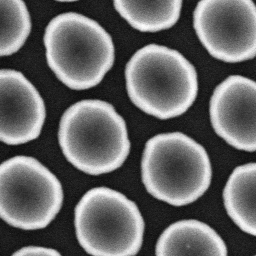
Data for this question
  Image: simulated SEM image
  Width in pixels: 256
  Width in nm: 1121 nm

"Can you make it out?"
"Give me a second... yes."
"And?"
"raised bodies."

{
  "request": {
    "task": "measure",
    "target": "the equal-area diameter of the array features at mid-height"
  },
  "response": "293 nm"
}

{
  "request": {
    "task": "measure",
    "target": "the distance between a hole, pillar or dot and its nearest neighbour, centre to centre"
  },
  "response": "383 nm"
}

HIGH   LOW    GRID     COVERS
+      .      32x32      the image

+++............+++++++...++++++.
+++............+++++++...+++++++
+++....++++.....++++++..++++++++
+++...++++++......+......+++++++
+++...+++++++............+++++++
++....++++++++............++++++
+.....++++++++...++++......+++++
......++++++++...++++++.........
.......++++++...++++++++........
++......+++++...++++++++........
++++.....+++....++++++++....++++
++++............++++++++...+++++
+++++............+++++++...+++++
+++++....+++++....+++++....+++++
+++++...+++++++.....+......+++++
+++++...+++++++............+++++
++++....++++++++...........+++++
.++.....++++++++...+++++.....+++
........++++++++...++++++.....++
.........++++++...++++++++......
.+++......+++++...++++++++......
++++++............++++++++...+++
+++++++...........++++++++...+++
+++++++............+++++++..++++
+++++++....++++.....++++....++++
+++++++...++++++.............+++
+++++++...+++++++............+++
.+++++....+++++++.............++
..........++++++++...+++++.....+
..........++++++++..+++++++.....
..........+++++++...++++++++....
...++++....+++++....++++++++....